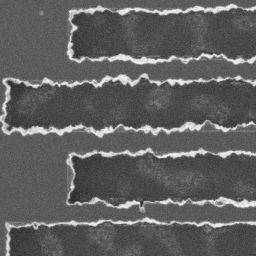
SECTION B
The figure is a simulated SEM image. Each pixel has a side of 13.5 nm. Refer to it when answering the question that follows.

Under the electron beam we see one or a few lines or trenches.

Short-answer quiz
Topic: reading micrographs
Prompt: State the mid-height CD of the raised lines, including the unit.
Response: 313 nanometres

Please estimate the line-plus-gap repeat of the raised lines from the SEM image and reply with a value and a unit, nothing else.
0.962 um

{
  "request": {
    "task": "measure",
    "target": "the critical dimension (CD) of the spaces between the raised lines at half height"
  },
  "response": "640 nanometres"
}